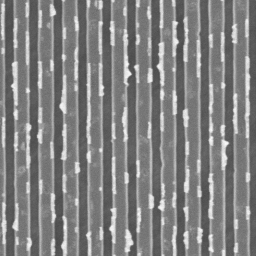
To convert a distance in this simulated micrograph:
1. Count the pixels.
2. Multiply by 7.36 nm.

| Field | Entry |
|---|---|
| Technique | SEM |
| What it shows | parallel lines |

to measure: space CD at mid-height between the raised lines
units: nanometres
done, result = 69.9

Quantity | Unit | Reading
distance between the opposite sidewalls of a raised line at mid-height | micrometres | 0.109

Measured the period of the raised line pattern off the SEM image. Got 180 nm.